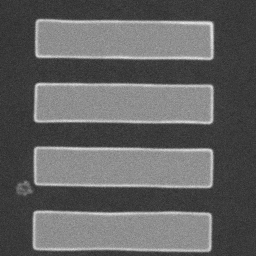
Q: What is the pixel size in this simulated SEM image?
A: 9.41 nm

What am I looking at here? groups of lines, slits or small figures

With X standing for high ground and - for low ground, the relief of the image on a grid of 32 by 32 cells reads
--------------------------------
--------------------------------
--------------------------------
-----XXXXXXXXXXXXXXXXXXXXX------
-----XXXXXXXXXXXXXXXXXXXXXX-----
-----XXXXXXXXXXXXXXXXXXXXXX-----
-----XXXXXXXXXXXXXXXXXXXXXX-----
--------------------------------
--------------------------------
--------------------------------
--------------------------------
----XXXXXXXXXXXXXXXXXXXXXXX-----
----XXXXXXXXXXXXXXXXXXXXXXX-----
----XXXXXXXXXXXXXXXXXXXXXXX-----
----XXXXXXXXXXXXXXXXXXXXXXX-----
--------------------------------
--------------------------------
--------------------------------
-----XXXX-----------------------
----XXXXXXXXXXXXXXXXXXXXXXX-----
----XXXXXXXXXXXXXXXXXXXXXXX-----
----XXXXXXXXXXXXXXXXXXXXXXX-----
----XXXXXXXXXXXXXXXXXXXXXXX-----
--------------------------------
--------------------------------
--------------------------------
-----XXX------------------------
----XXXXXXXXXXXXXXXXXXXXXX------
----XXXXXXXXXXXXXXXXXXXXXX------
----XXXXXXXXXXXXXXXXXXXXXX------
----XXXXXXXXXXXXXXXXXXXXXX------
--------------------------------